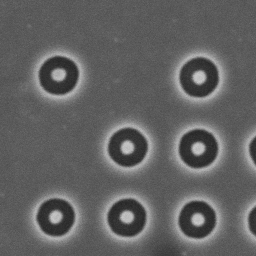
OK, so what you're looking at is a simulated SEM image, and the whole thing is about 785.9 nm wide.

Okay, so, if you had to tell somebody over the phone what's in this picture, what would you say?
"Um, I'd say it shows ring-shaped grooves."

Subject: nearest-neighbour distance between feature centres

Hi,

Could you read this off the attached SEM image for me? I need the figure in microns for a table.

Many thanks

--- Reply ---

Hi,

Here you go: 0.217